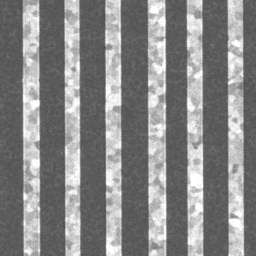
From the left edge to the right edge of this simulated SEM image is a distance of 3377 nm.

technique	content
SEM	parallel lines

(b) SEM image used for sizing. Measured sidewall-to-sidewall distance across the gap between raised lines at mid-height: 0.351 microns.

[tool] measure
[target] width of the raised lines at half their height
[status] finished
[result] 193 nm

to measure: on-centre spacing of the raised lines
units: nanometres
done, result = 540